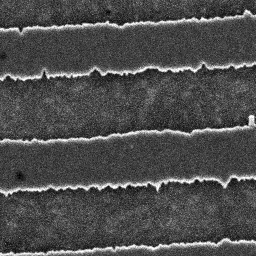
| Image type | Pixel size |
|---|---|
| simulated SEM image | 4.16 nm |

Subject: one or a few lines or trenches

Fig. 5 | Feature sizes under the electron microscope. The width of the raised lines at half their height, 208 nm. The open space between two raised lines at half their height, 258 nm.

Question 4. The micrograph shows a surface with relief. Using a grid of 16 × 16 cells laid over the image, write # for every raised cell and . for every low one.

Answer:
................
......#.########
################
################
#########.......
................
................
................
.......#########
################
################
##########......
................
................
................
.......#########